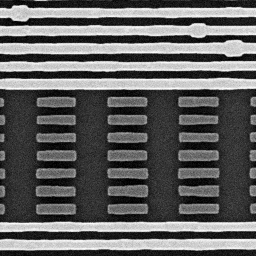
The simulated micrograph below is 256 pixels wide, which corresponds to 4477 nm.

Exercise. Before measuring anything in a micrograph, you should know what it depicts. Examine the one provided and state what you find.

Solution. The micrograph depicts wiring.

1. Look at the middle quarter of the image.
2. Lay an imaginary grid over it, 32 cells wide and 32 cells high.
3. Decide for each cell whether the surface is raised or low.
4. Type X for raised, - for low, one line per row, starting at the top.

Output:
XXXXXXXXXXXXXXXXXXXXXXXXXXXXXXXX
XXXXXXXXXXXXXXX--XXXXXXXXXXXXXXX
--------------------------------
--------------------------------
XXXXXXXXXXXXXXXXXXXXXXXXXXXXXXXX
XXXXXXXXXXXXXXXXXXXXXXXXXXXXXXXX
--------------------------------
--------------------------------
XXX--------XXXXXXXXX---------XXX
XXX--------XXXXXXXXXX--------XXX
XX---------XXXX--------------XXX
--------------------------------
--------------------------------
XXX--------XXXXXXXXX---------XXX
XXX--------XXXXXXXXX---------XXX
--------------------------------
--------------------------------
-----------XXXXXXXXX---------XXX
XXX--------XXXXXXXXXX--------XXX
---------------X----------------
--------------------------------
--------------------------------
XXX--------XXXXXXXXX---------XXX
XXX--------XXXXXXXXX---------XXX
--------------------------------
--------------------------------
XXX--------XXXXXXXXXX--------XXX
XXX--------XXXXXXXXXX--------XXX
----------------XXXXX--------XX-
--------------------------------
---------------XXXXX------------
XXX--------XXXXXXXXXX--------XXX